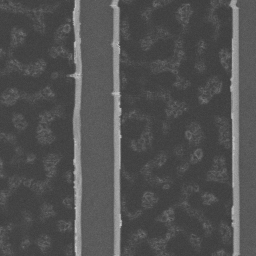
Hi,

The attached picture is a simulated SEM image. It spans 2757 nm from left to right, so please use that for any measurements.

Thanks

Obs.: one or a few lines or trenches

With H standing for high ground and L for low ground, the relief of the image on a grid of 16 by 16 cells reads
HHHHHLLHHHHHHHHL
HHHHHLLHHHHHHHHL
HHHHHLLHHHHHHHHL
HHHHHLLHHHHHHHHL
HHHHHLLHHHHHHHHL
HHHHHLLHHHHHHHHL
HHHHHLLHHHHHHHHL
HHHHHLLHHHHHHHHL
HHHHHLLHHHHHHHHL
HHHHHLLHHHHHHHHL
HHHHHLLHHHHHHHHL
HHHHHLLHHHHHHHHL
HHHHHLLHHHHHHHHL
HHHHHLLHHHHHHHHL
HHHHHLLHHHHHHHHL
HHHHHLLHHHHHHHHL